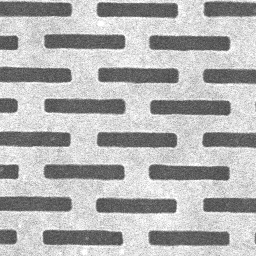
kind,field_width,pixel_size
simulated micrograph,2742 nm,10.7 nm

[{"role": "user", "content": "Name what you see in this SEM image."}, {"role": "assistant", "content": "a regular array of holes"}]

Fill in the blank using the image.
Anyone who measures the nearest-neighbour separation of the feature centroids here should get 657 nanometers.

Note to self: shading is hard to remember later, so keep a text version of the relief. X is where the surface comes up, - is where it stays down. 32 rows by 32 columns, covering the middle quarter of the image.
XXXXXXXXXXXXXXXXXXXXXXXXXXXXXXXX
--XXXXXXX--------------------XXX
--XXXXXXX--------------------XXX
--XXXXXX---------------------XXX
--XXXXXXX-------------------XXXX
XXXXXXXXXXXXXXXXXXXXXXXXXXXXXXXX
XXXXXXXXXXXXXXXXXXXXXXXXXXXXXXXX
XXXXXXXXXXXXXXXXXXXXXXXXXXXXXXXX
----XXXXXXXXXXXXXXXXXXXXXXXXXXXX
---------------XXXXXXX----------
---------------XXXXXX-----------
---------------XXXXXX-----------
XXXXXXXXX------XXXXXXX----------
XXXXXXXXXXXXXXXXXXXXXXXXXXXXXXXX
XXXXXXXXXXXXXXXXXXXXXXXXXXXXXXXX
XXXXXXXXXXXXXXXXXXXXXXXXXXXXXXXX
XXXXXXXXXXXXXXXXXXXXXXXXXXXXXXXX
-XXXXXXX--------------------XXXX
--XXXXXX--------------------XXXX
--XXXXXX--------------------XXXX
-XXXXXXXX-------------------XXXX
XXXXXXXXXXXXXXXXXXXXXXXXXXXXXXXX
XXXXXXXXXXXXXXXXXXXXXXXXXXXXXXXX
XXXXXXXXXXXXXXXXXXXXXXXXXXXXXXXX
XXXXXXXXXXXXXXXXXXXXXXXXXXXXXXXX
---------------XXXXXX-----------
---------------XXXXXX-----------
---------------XXXXXX-----------
---------------XXXXXX-----------
XXXXXXXXXXXXXXXXXXXXXXXXXXXXXXXX
XXXXXXXXXXXXXXXXXXXXXXXXXXXXXXXX
XXXXXXXXXXXXXXXXXXXXXXXXXXXXXXXX